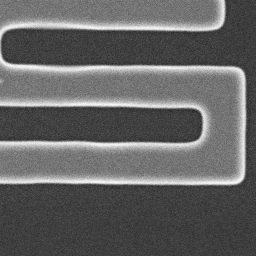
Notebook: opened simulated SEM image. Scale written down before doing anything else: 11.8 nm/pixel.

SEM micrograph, groups of lines, slits or small figures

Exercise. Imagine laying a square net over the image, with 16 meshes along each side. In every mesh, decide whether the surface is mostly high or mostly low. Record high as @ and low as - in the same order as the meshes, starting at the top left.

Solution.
@@@@@@@@@@@@@@--
@@@@@@@@@@@@@@--
----------------
----------------
@@@@@@@@@@@@@@@-
@@@@@@@@@@@@@@@-
@@@@@@@@@@@@@@@-
-------------@@-
-------------@@-
@@@@@@@@@@@@@@@-
@@@@@@@@@@@@@@@-
-----------@@---
----------------
----------------
----------------
----------------